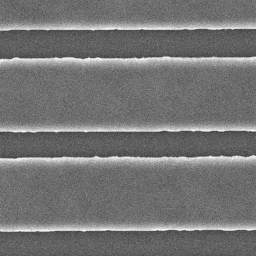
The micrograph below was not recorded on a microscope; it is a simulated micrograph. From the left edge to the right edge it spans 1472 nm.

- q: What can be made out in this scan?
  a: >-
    lines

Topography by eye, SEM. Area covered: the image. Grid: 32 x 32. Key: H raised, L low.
HHHHHHHHHHHHHHHHHHHHHHHHHHHHHHHH
HHHHHHHHHHHHHHHHHHHHHHHHHHHHHHHH
HHHHHHHHHHHHHHHHHHHHHHHHHHHHHHHH
HHHHHHHHHHHHHHHHHHHHHHHHHHHHHHHH
LLLLLLLLLLLLLLLLLLLLLLLLLLLLLLLL
LLLLLLLLLLLLLLLLLLLLLLLLLLLLLLLL
LLLLLLLLLLLLLLLLLLLLLLLLLLLLLLLL
HHHHHHHHHHHHHHHHHHHHHHHHHHHHHHHH
HHHHHHHHHHHHHHHHHHHHHHHHHHHHHHHH
HHHHHHHHHHHHHHHHHHHHHHHHHHHHHHHH
HHHHHHHHHHHHHHHHHHHHHHHHHHHHHHHH
HHHHHHHHHHHHHHHHHHHHHHHHHHHHHHHH
HHHHHHHHHHHHHHHHHHHHHHHHHHHHHHHH
HHHHHHHHHHHHHHHHHHHHHHHHHHHHHHHH
HHHHHHHHHHHHHHHHHHHHHHHHHHHHHHHH
HHHHHHHHHHHHHHHHHHHHHHHHHHHHHHHH
LLLLLLLLLLLLLLLLLLLLLLLLLLLLLLLL
LLLLLLLLLLLLLLLLLLLLLLLLLLLLLLLL
LLLLLLLLLLLLLLLLLLLLLLLLLLLLLLLL
LLLLLLLLLLLLLLLLLLLLLLLLLLLLLLLL
HHHHHHHHHHHHHHHHHHHHHHHHHHHHHHHH
HHHHHHHHHHHHHHHHHHHHHHHHHHHHHHHH
HHHHHHHHHHHHHHHHHHHHHHHHHHHHHHHH
HHHHHHHHHHHHHHHHHHHHHHHHHHHHHHHH
HHHHHHHHHHHHHHHHHHHHHHHHHHHHHHHH
HHHHHHHHHHHHHHHHHHHHHHHHHHHHHHHH
HHHHHHHHHHHHHHHHHHHHHHHHHHHHHHHH
HHHHHHHHHHHHHHHHHHHHHHHHHHHHHHHH
HHHHHHHHHHHHHHHHHHHHHHHHHHHHHHHH
LLLLLLLLLLLLLLLLLLLLLLLLLLLLLLLL
LLLLLLLLLLLLLLLLLLLLLLLLLLLLLLLL
LLLLLLLLLLLLLLLLLLLLLLLLLLLLLLLL